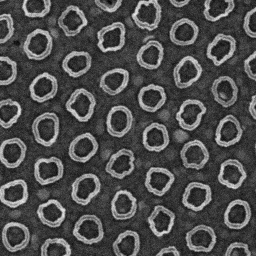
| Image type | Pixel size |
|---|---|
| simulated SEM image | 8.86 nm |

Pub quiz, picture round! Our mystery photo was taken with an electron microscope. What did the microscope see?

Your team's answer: a regular array of ring-shaped raised bodies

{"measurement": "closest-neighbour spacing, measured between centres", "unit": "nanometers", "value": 376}